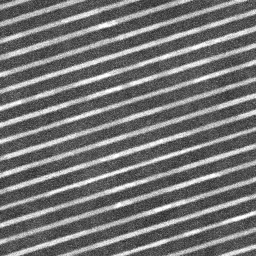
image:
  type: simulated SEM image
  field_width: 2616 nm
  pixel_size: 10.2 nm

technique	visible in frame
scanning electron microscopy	parallel lines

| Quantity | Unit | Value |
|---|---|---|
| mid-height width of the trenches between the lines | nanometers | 127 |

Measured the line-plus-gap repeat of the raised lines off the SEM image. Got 164 nanometres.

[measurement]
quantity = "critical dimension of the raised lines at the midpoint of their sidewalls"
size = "34.2 nanometers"